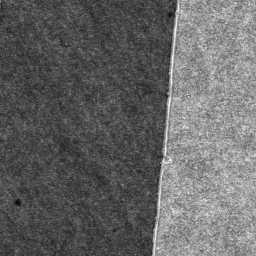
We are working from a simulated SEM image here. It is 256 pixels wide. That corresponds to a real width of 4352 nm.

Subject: one or a few lines or trenches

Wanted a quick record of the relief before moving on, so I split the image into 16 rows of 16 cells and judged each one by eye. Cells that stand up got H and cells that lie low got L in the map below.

LLLLLLLLLLLHHHHH
LLLLLLLLLLLHHHHH
LLLLLLLLLLLHHHHH
LLLLLLLLLLLHHHHH
LLLLLLLLLLLHHHHH
LLLLLLLLLLLHHHHH
LLLLLLLLLLLHHHHH
LLLLLLLLLLHHHHHH
LLLLLLLLLLHHHHHH
LLLLLLLLLLHHHHHH
LLLLLLLLLLHHHHHH
LLLLLLLLLLHHHHHH
LLLLLLLLLLHHHHHH
LLLLLLLLLLHHHHHH
LLLLLLLLLLHHHHHH
LLLLLLLLLLHHHHHH